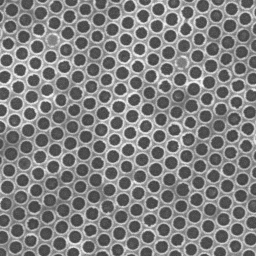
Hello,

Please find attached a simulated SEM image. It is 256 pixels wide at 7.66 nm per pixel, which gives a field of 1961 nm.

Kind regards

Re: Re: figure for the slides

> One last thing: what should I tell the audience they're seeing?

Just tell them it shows a regular array of holes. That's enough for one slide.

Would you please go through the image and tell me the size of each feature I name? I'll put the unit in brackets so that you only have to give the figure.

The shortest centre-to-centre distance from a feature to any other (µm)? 0.127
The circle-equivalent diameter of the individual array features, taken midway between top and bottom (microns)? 0.0978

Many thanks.